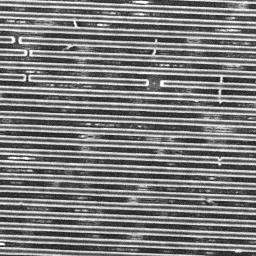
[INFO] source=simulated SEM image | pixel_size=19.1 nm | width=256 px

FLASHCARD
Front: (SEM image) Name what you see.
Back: parallel lines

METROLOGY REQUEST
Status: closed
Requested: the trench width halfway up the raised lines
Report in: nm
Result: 144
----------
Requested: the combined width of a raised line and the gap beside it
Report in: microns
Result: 0.237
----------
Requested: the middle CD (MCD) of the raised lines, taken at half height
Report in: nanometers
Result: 108